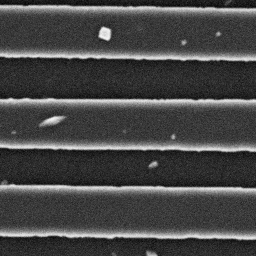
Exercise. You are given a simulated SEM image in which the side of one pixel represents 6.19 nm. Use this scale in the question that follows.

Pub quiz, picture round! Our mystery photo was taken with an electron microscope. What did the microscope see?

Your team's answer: lines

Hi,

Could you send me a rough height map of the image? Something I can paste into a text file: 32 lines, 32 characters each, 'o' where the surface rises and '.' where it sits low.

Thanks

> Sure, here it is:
................................
oooooooooooooooooooooooooooooooo
oooooooooooooooooooooooooooooooo
oooooooooooooooooooooooooooooooo
oooooooooooooooooooooooooooooooo
oooooooooooooooooooooooooooooooo
oooooooooooooooooooooooooooooooo
..............................o.
................................
................................
................................
................................
oooooooooooooooooooooooo.oo.oooo
oooooooooooooooooooooooooooooooo
oooooooooooooooooooooooooooooooo
oooooooooooooooooooooooooooooooo
oooooooooooooooooooooooooooooooo
oooooooooooooooooooooooooooooooo
.......ooooooooooooooooooooooooo
................................
................................
................................
................................
ooooooooooooooooooooooooooooooo.
oooooooooooooooooooooooooooooooo
oooooooooooooooooooooooooooooooo
oooooooooooooooooooooooooooooooo
oooooooooooooooooooooooooooooooo
oooooooooooooooooooooooooooooooo
........oooooooooooooooooooooooo
................................
................................